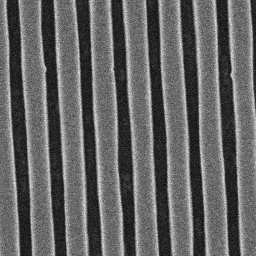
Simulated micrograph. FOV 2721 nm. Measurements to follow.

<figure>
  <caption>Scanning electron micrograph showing parallel lines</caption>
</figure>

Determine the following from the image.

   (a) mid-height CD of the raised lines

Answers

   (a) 0.235 µm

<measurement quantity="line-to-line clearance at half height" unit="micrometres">0.134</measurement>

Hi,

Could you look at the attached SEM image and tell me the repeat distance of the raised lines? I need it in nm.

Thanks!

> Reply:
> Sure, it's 369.